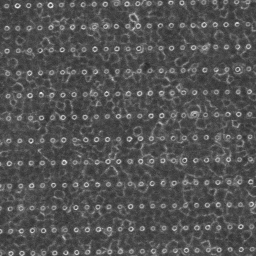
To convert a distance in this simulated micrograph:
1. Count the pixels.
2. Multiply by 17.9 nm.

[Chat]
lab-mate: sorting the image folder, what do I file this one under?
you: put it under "a regular array of holes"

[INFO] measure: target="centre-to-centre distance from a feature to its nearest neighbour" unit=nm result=123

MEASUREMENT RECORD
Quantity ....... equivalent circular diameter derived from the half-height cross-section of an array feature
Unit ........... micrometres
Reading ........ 0.0572